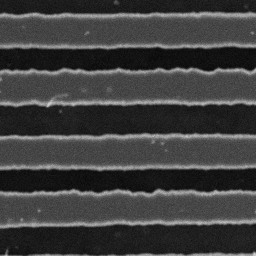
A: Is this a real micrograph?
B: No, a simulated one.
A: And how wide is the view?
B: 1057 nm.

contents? lines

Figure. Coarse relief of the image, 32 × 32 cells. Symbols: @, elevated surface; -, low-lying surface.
--------------------------------
--------------------------------
@@@@@@@@@@@@@@@@@@@@@@@@@@@@@@@@
@@@@@@@@@@@@@@@@@@@@@@@@@@@@@@@@
@@@@@@@@@@@@@@@@@@@@@@@@@@@@@@@@
@@@@@@@@@@@@@@@@@@@@@@@@@@@@@@@@
--------------------------------
--------------------------------
----------------------@---------
@@@@@@@@@@@@@@@@@@@@@@@@@@@@@@@@
@@@@@@@@@@@@@@@@@@@@@@@@@@@@@@@@
@@@@@@@@@@@@@@@@@@@@@@@@@@@@@@@@
@@@@@@@@@@@@@@@@@@@@@@@@@@@@@@@@
--------------------------------
--------------------------------
--------------------------------
--------------------------------
@@@@@@@@@@@@@@@@@@@@@@@@@@@@@@@@
@@@@@@@@@@@@@@@@@@@@@@@@@@@@@@@@
@@@@@@@@@@@@@@@@@@@@@@@@@@@@@@@@
@@@@@@@@@@@@@@@@@@@@@@@@@@@@@@@@
--------------------------------
--------------------------------
--------------------------------
@@@@@@@@@@@@@@@@@@@@@@@@@@@@@@@@
@@@@@@@@@@@@@@@@@@@@@@@@@@@@@@@@
@@@@@@@@@@@@@@@@@@@@@@@@@@@@@@@@
@@@@@@@@@@@@@@@@@@@@@@@@@@@@@@@@
@-------------------------------
--------------------------------
--------------------------------
--------------------------------